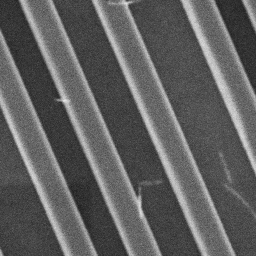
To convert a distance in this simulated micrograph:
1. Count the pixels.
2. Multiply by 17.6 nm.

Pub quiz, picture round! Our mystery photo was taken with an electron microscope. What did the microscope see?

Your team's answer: lines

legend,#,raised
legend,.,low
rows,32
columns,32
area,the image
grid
...####.....####.......####....#
...####.....####.......####....#
...####......####.......####...#
....####.....####.......####....
....####......####.......####...
#....####.....####.......####...
#....####.....####........####..
##....####.....####.......####..
##....####.....####........###..
###....####.....####.......####.
###....####.....####.......####.
###....####......####.......####
####....####.....####.......####
####....####.....####........###
.####....####.....####.......###
.####....####.....####.......###
..####....####.....####.......##
..####....####.....####.......##
..####....####......####.......#
...####....####.....####.......#
...####....####.....####.......#
....####....####.....####.......
....####....####.....####.......
.....###.....####.....####......
.....####....####.....####......
.....####....#####.....####.....
......####....####.....####.....
......####....####.....####.....
.......####....####.....####....
.......####....####.....####....
........###....####......####...
........####....####.....####...